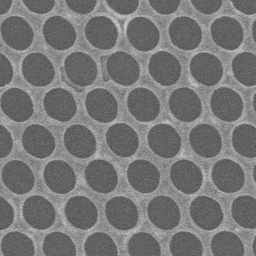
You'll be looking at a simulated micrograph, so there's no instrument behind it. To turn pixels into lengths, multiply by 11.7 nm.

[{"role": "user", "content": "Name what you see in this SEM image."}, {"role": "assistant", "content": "a regular array of holes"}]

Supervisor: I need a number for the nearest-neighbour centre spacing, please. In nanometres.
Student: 479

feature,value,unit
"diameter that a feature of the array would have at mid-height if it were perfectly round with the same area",394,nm